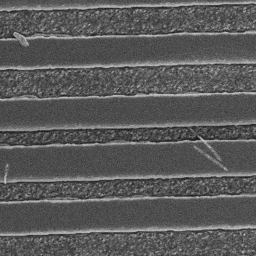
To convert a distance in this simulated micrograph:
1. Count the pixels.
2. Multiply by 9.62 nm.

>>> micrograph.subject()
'lines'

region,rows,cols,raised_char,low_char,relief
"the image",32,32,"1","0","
11111111111111111111111111110000
00000000000000000000000000000000
00000000000000000000000000000000
00000000000000000000000000000000
00100000000000000111111111111111
11111111111111111111111111111111
11111111111111111111111111111111
11111111111111111111111111111111
11111100000000000000000000000000
00000000000000000000000000000000
00000000000000000000000000000000
00000000000000000000000000000000
11111111111111111111111111111111
11111111111111111111111111111111
11111111111111111111111111111111
11111111111111111111111111111110
00000000000000000000000000000000
00000000000000000000000001110001
11111111111111111111111111111111
11111111111111111111111111111111
11111111111111111111111111111111
11111111111111111111111111111111
11111111111100000000000000000000
00000000000000000000000000000000
00000000000000000000000000011111
11111111111111111111111111111111
11111111111111111111111111111111
11111111111111111111111111111111
11111111111111111111111111111100
00000000000000000000000000000000
00000000000000000000000000000000
00000000000000000000000000000000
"